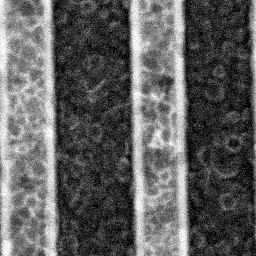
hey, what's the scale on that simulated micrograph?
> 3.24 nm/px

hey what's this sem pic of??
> one or a few lines or trenches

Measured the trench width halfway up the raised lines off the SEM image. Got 88.1 px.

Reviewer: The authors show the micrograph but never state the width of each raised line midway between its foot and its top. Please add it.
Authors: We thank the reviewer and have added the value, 144 nanometers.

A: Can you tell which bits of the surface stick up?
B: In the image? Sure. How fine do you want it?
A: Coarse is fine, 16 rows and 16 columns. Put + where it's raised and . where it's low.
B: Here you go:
+++.....+++.....
+++.....+++.....
+++.....+++.....
+++......++.....
+++......++.....
+++......++.....
+++......++.....
+++......++.....
+++......++.....
+++......++.....
+++......++.....
+++......++.....
+++......++.....
+++......++.....
+++......++.....
+++......++.....